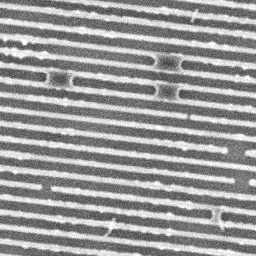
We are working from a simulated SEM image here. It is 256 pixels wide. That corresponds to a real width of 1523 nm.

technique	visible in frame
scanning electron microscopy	parallel lines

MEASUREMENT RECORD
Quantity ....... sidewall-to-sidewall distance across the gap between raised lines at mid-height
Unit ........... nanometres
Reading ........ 58.3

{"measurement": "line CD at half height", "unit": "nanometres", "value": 26.6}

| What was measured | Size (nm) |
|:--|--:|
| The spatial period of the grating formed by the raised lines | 87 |